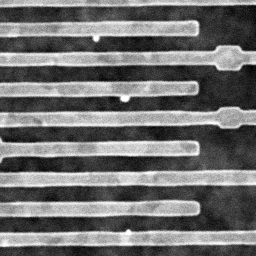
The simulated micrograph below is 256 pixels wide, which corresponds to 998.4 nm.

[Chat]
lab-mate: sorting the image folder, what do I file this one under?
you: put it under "wiring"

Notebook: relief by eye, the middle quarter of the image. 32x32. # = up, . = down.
................................
................................
................................
................................
.....................###........
################################
################################
#############################...
..............##................
................................
................................
................................
################################
################################
################################
................................
................................
................................
................................
............................####
################################
################################
################################
................................
................................
................................
................................
################################
################################
################################
................................
................................